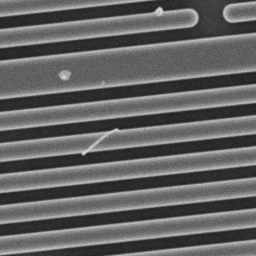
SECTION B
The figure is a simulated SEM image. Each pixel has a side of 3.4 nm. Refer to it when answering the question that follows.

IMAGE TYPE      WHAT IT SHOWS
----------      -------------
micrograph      groups of lines, slits or small figures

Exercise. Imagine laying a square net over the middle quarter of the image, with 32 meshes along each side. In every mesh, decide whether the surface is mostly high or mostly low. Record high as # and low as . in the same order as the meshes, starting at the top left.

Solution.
################################
################################
################################
################################
######################..........
############....................
#####...........................
..........................######
..................##############
........########################
################################
###############################.
#####################...........
#############...................
###.............................
.........................#######
.............#.#################
.....###########################
################################
#############################...
###################.............
###########.....................
#..............................#
.......................#########
.............###################
...#############################
################################
##########################......
################................
########........................
.............................###
.....................###########